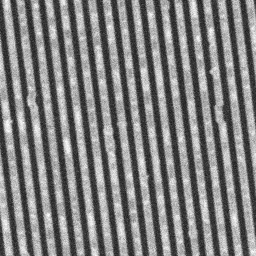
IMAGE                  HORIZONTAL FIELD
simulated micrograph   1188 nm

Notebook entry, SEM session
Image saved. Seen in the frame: parallel lines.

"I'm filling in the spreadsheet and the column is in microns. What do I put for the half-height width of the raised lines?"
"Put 0.0288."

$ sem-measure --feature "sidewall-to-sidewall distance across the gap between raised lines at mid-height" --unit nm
36.8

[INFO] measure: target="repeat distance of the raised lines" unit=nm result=66